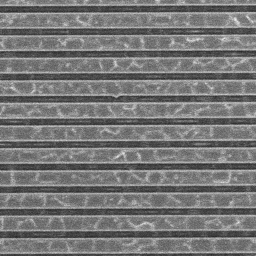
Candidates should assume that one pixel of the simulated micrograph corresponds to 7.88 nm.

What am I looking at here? parallel lines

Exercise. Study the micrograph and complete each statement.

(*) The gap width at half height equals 60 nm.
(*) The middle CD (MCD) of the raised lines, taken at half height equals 0.12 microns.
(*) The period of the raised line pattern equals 0.177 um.